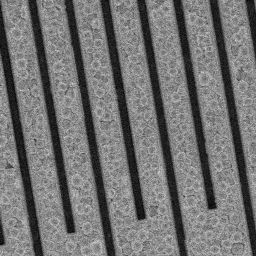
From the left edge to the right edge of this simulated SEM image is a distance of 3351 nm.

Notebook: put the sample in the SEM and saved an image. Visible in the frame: parallel lines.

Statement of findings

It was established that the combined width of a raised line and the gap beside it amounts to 468 nm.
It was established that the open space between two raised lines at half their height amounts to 139 nm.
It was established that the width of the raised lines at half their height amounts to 326 nanometres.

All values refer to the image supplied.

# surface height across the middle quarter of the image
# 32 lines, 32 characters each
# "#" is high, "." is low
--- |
##...######...#######..#######..
###..#######...######...######..
###...######...######...######..
###...######...######...######..
###...######...######...######..
###...######...#######..#######.
###...######....######..#######.
####..#######...######...######.
####...######...######...######.
####...######...######...######.
####...######...######...######.
####...######...#######..#######
####...######....######...######
#####..#######...######...######
#####...######...######...######
#####...######...######...######
#####...######...######...######
#####...######...######...######
#####...######....#####....#####
######..#######...######...#####
######...######...######...#####
######...######...######...#####
######...######...######...#####
######...######...######...#####
#######..#######...######...####
#######..#######...######...####
.######...######...######...####
.######...######...######...####
.######...######...######...####
.######...######...######...####
.#######..#######...######...###
.#######..#######...######...###